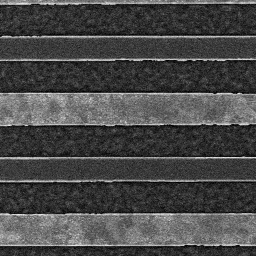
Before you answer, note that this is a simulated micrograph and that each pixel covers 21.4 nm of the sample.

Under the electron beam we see lines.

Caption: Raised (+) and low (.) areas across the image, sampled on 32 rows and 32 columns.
+++..........+..................
................................
................................
................................
................................
++++++++++++++++++++++++++++++++
++++++++++++++++++++++++++++++++
+++++++++++++++.....+...........
................................
................................
................................
................................
++++++++++++++++++++++++++++++++
++++++++++++++++++++++++++++++++
++++++++++++++++++++++++++++++++
+++++++++++++++++++++++++.+...+.
................................
................................
................................
................................
++++++++++++++++++++++++++++++++
++++++++++++++++++++++++++++++++
++++++++++++++++++++++++++++++++
................................
................................
................................
................................
++++++++++++++++++++++++++++++++
++++++++++++++++++++++++++++++++
++++++++++++++++++++++++++++++++
++++++++++++++++++++++++++++++++
................................